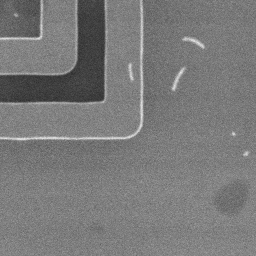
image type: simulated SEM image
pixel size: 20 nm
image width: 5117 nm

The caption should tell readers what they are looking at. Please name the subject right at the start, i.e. groups of lines, slits or small figures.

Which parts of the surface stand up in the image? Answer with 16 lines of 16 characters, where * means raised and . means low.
...**..**.......
...**..**.......
*****..**.......
*****..**.......
****...**.......
.......**.......
*********.......
*********.......
********........
................
................
................
................
................
................
................